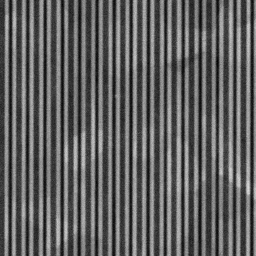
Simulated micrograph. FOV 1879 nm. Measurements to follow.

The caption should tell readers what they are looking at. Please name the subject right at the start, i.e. parallel lines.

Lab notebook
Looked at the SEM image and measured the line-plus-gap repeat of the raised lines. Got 0.0634 µm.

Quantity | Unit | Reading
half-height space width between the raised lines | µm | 0.0358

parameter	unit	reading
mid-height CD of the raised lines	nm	22